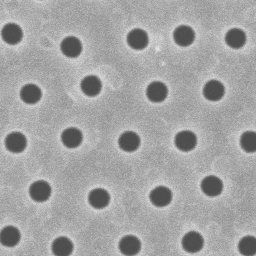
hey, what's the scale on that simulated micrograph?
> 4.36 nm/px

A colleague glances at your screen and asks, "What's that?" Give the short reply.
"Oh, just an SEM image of a regular array of holes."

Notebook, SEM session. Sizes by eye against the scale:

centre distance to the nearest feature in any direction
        0.228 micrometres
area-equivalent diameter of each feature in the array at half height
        0.0946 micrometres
